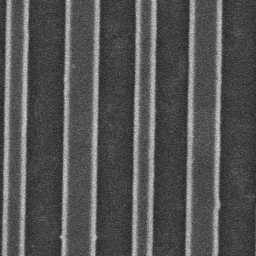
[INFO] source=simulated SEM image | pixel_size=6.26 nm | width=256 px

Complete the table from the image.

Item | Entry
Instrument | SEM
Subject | one or a few lines or trenches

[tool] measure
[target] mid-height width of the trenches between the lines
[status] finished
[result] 41 pixels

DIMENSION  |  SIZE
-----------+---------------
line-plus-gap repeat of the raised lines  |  393 nm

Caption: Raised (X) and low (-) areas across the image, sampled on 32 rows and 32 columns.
-XX------XXX-----XX-----XXX-----
-XX------XXX-----XX-----XXX-----
-XX-----XXXX-----XX-----XXX-----
-XX-----XXXX-----XX-----XXX-----
-XX-----XXXX-----XX-----XXX-----
-XX-----XXXX-----XX-----XXX-----
-XX-----XXXX-----XX-----XXX-----
-XX-----XXXX-----XX-----XXX-----
-XX-----XXXX-----XX-----XXX-----
-XX-----XXXX-----XX-----XXX-----
-XX-----XXXX-----XX-----XXX-----
-XX-----XXXX-----XX-----XXX-----
-XX-----XXXX-----XX-----XXX-----
-XX-----XXXX-----XX-----XXX-----
-XX-----XXXX-----XX-----XXX-----
-XX-----XXXX-----XX-----XXX-----
-XX-----XXXX-----XX-----XXX-----
-XX-----XXXX-----XX-----XXX-----
-XX-----XXXX-----XX-----XXX-----
-XX-----XXXX-----XX-----XXX-----
-XX-----XXXX-----XX-----XXX-----
-XX-----XXXX-----XX-----XXX-----
-XX-----XXXX-----XX-----XXX-----
-XX-----XXXX-----XX-----XXX-----
-XX-----XXXX-----XX-----XXX-----
-XX-----XXXX-----XX-----XXX-----
-XX-----XXXX-----XX-----XXX-----
-XX-----XXXX-----XX-----XXX-----
-XX-----XXXX-----XX-----XXX-----
-XX-----XXXX-----XX-----XXX-----
-XX-----XXXX-----XX----XXXX-----
-XX-----XXXX-----XX----XXXX-----